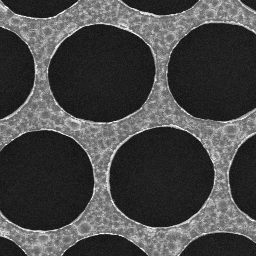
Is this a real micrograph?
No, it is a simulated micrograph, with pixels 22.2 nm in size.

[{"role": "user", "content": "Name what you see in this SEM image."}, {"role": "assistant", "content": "holes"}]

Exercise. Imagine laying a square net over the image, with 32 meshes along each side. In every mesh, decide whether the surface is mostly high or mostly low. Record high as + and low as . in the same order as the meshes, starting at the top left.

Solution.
.........+++++++........++++++..
++......++++++++++.....+++++++++
++++++++++++++++++++++++++++++++
.+++++++++.....+++++++++.......+
..+++++++........++++++.........
...+++++..........++++..........
....+++............++...........
....++.............++...........
....++..............+...........
....++.............++...........
....++.............++...........
....++.............++...........
...++++...........++++..........
..++++++..........+++++.........
.++++++++.......++++++++.......+
++++++++++++++++++++++++++++++++
++++...++++++++++......+++++++++
++.......+++++++.........++++++.
..........+++++...........++++..
...........+++............+++...
...........+++.............++...
............++.............++...
............++.............++...
............++.............++...
............++............+++...
...........+++............+++...
..........+++++..........+++++..
+........+++++++.......+++++++++
+++.....+++++++++++.++++++++++++
+++++++++++....++++++++++......+
..+++++++........+++++++........
...+++++..........+++++.........